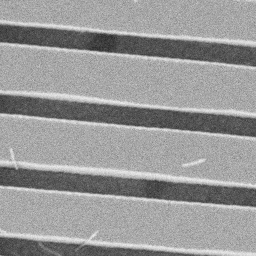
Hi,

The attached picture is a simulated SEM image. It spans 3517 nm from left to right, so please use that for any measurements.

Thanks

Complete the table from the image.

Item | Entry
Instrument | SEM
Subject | lines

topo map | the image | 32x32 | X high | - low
XXXXXXXXXXXXXXXXXXXXXXXXXXXXXXXX
XXXXXXXXXXXXXXXXXXXXXXXXXXXXXXXX
XXXXXXXXXXXXXXXXXXXXXXXXXXXXXXXX
-------XXXXXXXXXXXXXXXXXXXXXXXXX
------------------XXXXXXXXXXXXXX
X-----------------------------XX
XXXXXXXXXXXXX-------------------
XXXXXXXXXXXXXXXXXXXXXXX---------
XXXXXXXXXXXXXXXXXXXXXXXXXXXXXXXX
XXXXXXXXXXXXXXXXXXXXXXXXXXXXXXXX
XXXXXXXXXXXXXXXXXXXXXXXXXXXXXXXX
XXXXXXXXXXXXXXXXXXXXXXXXXXXXXXXX
----------XXXXXXXXXXXXXXXXXXXXXX
--------------------XXXXXXXXXXXX
XXX----------------------------X
XXXXXXXXXXXXXX------------------
XXXXXXXXXXXXXXXXXXXXXXXXXX------
XXXXXXXXXXXXXXXXXXXXXXXXXXXXXXXX
XXXXXXXXXXXXXXXXXXXXXXXXXXXXXXXX
XXXXXXXXXXXXXXXXXXXXXXXXXXXXXXXX
XXXXXXXXXXXXXXXXXXXXXXXXXXXXXXXX
-----------XXXXXXXXXXXXXXXXXXXXX
----------------------XXXXXXXXXX
XX------------------------------
XXXXXXXXXXXXXXX-----------------
XXXXXXXXXXXXXXXXXXXXXXXXXXX-----
XXXXXXXXXXXXXXXXXXXXXXXXXXXXXXXX
XXXXXXXXXXXXXXXXXXXXXXXXXXXXXXXX
XXXXXXXXXXXXXXXXXXXXXXXXXXXXXXXX
-XXXXXXXXXXXXXXXXXXXXXXXXXXXXXXX
-----------XXXXXXXXXXXXXXXXXXXXX
------------------------XXXXXXXX